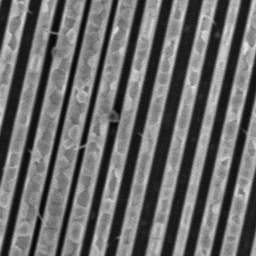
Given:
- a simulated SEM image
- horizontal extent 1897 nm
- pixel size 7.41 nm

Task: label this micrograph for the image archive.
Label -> parallel lines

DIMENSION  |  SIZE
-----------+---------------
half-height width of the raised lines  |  0.106 microns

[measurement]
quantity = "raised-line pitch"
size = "190 nanometres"